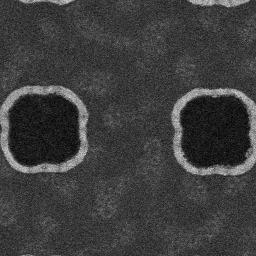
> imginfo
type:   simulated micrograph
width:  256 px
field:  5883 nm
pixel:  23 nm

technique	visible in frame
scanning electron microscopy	raised bodies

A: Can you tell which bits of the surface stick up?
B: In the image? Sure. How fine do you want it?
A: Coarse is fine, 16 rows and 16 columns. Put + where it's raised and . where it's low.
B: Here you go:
................
................
................
................
................
................
+++++......+++++
+++++......+++++
+++++......+++++
+++++......+++++
.+++........+++.
................
................
................
................
................